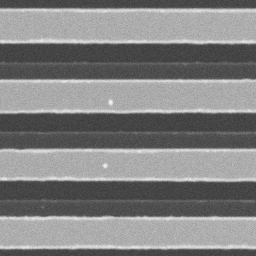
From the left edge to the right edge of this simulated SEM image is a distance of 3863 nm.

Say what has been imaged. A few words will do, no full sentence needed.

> lines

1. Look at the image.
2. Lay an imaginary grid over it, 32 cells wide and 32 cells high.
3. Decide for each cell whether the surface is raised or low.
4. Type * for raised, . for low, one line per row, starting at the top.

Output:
................................
********************************
********************************
********************************
********************************
................................
................................
................................
................................
................................
********************************
********************************
********************************
********************************
................................
................................
................................
................................
................................
********************************
********************************
********************************
********************************
................................
................................
................................
................................
********************************
********************************
********************************
********************************
................................